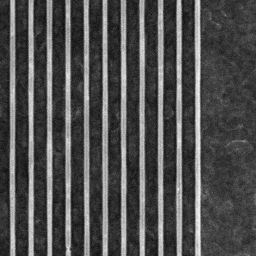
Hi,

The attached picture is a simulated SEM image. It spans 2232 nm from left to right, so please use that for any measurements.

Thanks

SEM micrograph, parallel lines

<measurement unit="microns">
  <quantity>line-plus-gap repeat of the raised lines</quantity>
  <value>0.161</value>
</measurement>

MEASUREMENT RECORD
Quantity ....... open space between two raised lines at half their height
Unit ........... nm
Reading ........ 128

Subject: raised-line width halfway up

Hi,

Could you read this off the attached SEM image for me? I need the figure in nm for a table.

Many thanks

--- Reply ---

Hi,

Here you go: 31.6